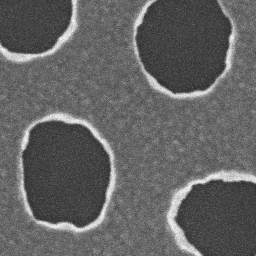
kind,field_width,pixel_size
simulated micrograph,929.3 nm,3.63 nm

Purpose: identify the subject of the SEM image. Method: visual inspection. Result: holes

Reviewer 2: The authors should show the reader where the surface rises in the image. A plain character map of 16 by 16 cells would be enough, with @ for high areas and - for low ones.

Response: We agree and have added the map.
-----@@@@-----@@
-----@@@@-----@@
----@@@@------@@
@-@@@@@@@-----@@
@@@@@@@@@-----@@
@@@@@@@@@@---@@@
@@@@@@@@@@@@@@@@
@@@-@@@@@@@@@@@@
@@----@@@@@@@@@@
@------@@@@@@@@@
@------@@@@@@@@@
@------@@@@@----
@@-----@@@@-----
@@----@@@@@-----
@@@@@@@@@@@-----
@@@@@@@@@@@@----